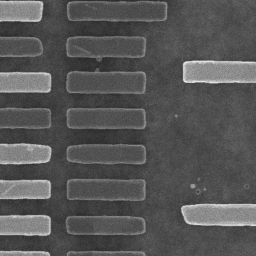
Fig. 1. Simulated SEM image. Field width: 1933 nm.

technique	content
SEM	wiring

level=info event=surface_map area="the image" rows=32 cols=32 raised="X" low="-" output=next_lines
XXXXX----XXXXXXXXXXXX-----------
XXXXX----XXXXXXXXXXXX-----------
XXXXX----X---XXXXXXX------------
--------------------------------
--------------------------------
XXXXX---XXXXXXXXXX--------------
XXXXX---XXXXXXXXXX--------------
--------------------------------
-----------------------XXXXXXXXX
XXXXXX---XXXXXXXXX-----XXXXXXXXX
XXXXXX--XXXXXXXXXX--------------
XXXXXX---XXXXXXXXX--------------
--------------------------------
--------------------------------
XXXXXX--XXXXXXXXXX--------------
XXXXXX--XXXXXXXXXX--------------
--------------------------------
--------------------------------
XXXXXX---XXXXXXXXX--------------
XXXXXX--XXXXXXXXXX--------------
--------------------------------
--------------------------------
---------XXXXXXXXX--------------
XXXXXX--XXXXXXXXXX--------------
XXXXXX--XXXXXXXXXX--------------
--------------------------------
-----------------------XXXXXXXXX
XXXXXX--XXXXXXXXXX-----XXXXXXXXX
XXXXXX--XXXXXXXXXX--------------
--------------------------------
--------------------------------
XXX--------XX--X----------------